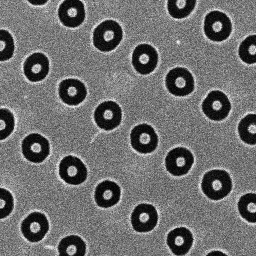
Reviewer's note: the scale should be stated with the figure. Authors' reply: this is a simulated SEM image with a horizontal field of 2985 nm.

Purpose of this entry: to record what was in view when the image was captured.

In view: a regular array of ring-shaped grooves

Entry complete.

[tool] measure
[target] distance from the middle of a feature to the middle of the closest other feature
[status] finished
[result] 504 nm